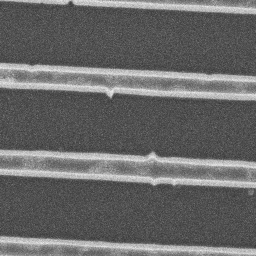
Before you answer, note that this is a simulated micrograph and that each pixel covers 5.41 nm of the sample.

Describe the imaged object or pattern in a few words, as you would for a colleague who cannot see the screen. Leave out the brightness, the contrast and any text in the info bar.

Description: one or a few lines or trenches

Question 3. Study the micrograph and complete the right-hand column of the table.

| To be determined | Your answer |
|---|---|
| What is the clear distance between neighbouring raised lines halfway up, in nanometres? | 365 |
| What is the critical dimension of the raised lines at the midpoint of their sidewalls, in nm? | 106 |